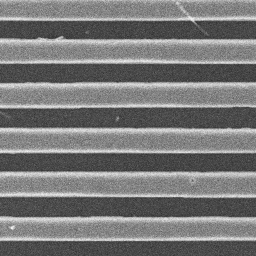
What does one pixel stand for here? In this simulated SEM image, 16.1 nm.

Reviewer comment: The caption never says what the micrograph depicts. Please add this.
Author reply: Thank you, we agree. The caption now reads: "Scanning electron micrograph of lines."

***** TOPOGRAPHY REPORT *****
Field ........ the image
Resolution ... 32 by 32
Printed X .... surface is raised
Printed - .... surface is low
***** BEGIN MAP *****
XXXXXXXXXXXXXXXXXXXXXXXXXXXXXXXX
XXXXXXXXXXXXXXXXXXXXXXXXXXXXXXXX
--XXXXXXXXXXXXXXXXXXXX-XX-------
--------------------------------
--------------------------------
XXXXXXXXXXXXXXXXXXXXXXXXXXXXXXXX
XXXXXXXXXXXXXXXXXXXXXXXXXXXXXXXX
XXXXXXXXXXXXXXXXXXXXXXXXXXXXXXXX
--------------------------------
--------------------------------
XXXXXXXXXXXXXXXXXXXXXXXXXXXXXXXX
XXXXXXXXXXXXXXXXXXXXXXXXXXXXXXXX
XXXXXXXXXXXXXXXXXXXXXXXXXXXXXXXX
--------------------------------
--------------------------------
--------------------------------
XXXXXXXXXXXXXXXXXXXXXXXXXXXXXXXX
XXXXXXXXXXXXXXXXXXXXXXXXXXXXXXXX
XXXXXXXXXXXXXXXXXXXXXXXXXXXXXXXX
--------------------------------
--------------------------------
--------------------------------
XXXXXXXXXXXXXXXXXXXXXXXXXXXXXXXX
XXXXXXXXXXXXXXXXXXXXXXXXXXXXXXXX
------------XXXXXXXXXXXXXXXXXXXX
--------------------------------
--------------------------------
XXXXXXXXXXXXXXXXXXXXXXXXXXXXXXXX
XXXXXXXXXXXXXXXXXXXXXXXXXXXXXXXX
XXXXXXXXXXXXXXXXXXXXXXXXXXXXXXXX
--------------------------------
--------------------------------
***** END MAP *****